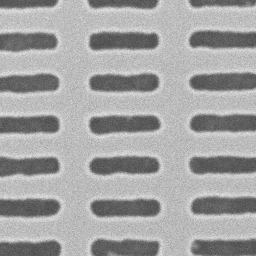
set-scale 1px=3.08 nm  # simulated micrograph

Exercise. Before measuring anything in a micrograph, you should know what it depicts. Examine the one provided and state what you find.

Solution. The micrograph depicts holes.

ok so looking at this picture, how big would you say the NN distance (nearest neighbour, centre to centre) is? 0.127 µm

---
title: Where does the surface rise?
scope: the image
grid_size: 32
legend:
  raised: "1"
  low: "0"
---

00000001111000000000111100000000
11111111111111111111111111111111
11111111111111111111111111111111
11111111111111111111111111111111
00000001111000000000111100000000
00000001111000000000111100000000
11111111111111111111111111111111
11111111111111111111111111111111
11111111111111111111111111111111
10000001111100000000111100000000
00000001111000000000111100000000
10000111111110011001111111111111
11111111111111111111111111111111
11111111111111111111111111111111
11110001111111000001111100000000
00000001111000000000111100000000
00000001111100000011111100011111
11111111111111111111111111111111
11111111111111111111111111111111
11111111111111100011111111100111
00000001111000000000111100000000
00000001111100000000111100000000
11111111111111111111111111111111
11111111111111111111111111111111
11111111111111111111111111111111
00000001111000000000111100000000
00000001111100000000111100000000
11111111111111111111111111111111
11111111111111111111111111111111
11111111111111111111111111111111
00000001111100000000111100000000
00000000111000000000111100000000